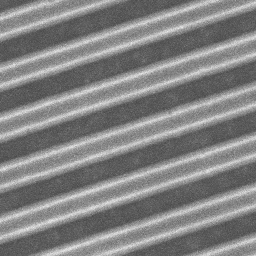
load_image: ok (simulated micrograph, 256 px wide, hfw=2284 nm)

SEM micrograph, parallel lines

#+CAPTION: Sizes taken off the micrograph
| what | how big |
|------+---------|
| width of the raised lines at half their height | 192 nm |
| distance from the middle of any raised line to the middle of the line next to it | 0.429 um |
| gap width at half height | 233 nanometers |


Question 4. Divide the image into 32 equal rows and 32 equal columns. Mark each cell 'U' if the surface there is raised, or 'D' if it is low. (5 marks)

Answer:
DDDDDUUUUUUUUDDDDDDDDDDDUUUUUUUU
DDUUUUUUUUDDDDDDDDDDDUUUUUUUUUDD
UUUUUUUDDDDDDDDDDDUUUUUUUUUDDDDD
UUUUDDDDDDDDDDDUUUUUUUUDDDDDDDDD
UDDDDDDDDDDDUUUUUUUUDDDDDDDDDDDU
DDDDDDDDDUUUUUUUUDDDDDDDDDDDUUUU
DDDDDDUUUUUUUUDDDDDDDDDDDUUUUUUU
DDDUUUUUUUUDDDDDDDDDDDUUUUUUUUUD
UUUUUUUUDDDDDDDDDDDUUUUUUUUUDDDD
UUUUUDDDDDDDDDDDUUUUUUUUUDDDDDDD
UUDDDDDDDDDDUUUUUUUUUUDDDDDDDDDD
DDDDDDDDDUUUUUUUUUDDDDDDDDDDDUUU
DDDDDDUUUUUUUUUDDDDDDDDDDDUUUUUU
DDDUUUUUUUUUDDDDDDDDDDDUUUUUUUUU
UUUUUUUUUDDDDDDDDDDDUUUUUUUUUDDD
UUUUUUDDDDDDDDDDDUUUUUUUUDDDDDDD
UUUDDDDDDDDDDDUUUUUUUUDDDDDDDDDD
DDDDDDDDDDDUUUUUUUUDDDDDDDDDDDUU
DDDDDDDUUUUUUUUUDDDDDDDDDDDUUUUU
DDDDUUUUUUUUUDDDDDDDDDDDUUUUUUUU
DUUUUUUUUUDDDDDDDDDDDUUUUUUUUUDD
UUUUUUUDDDDDDDDDDDUUUUUUUUUDDDDD
UUUUDDDDDDDDDDUUUUUUUUUUDDDDDDDD
UDDDDDDDDDDUUUUUUUUUDDDDDDDDDDDU
DDDDDDDDUUUUUUUUUDDDDDDDDDDDUUUU
DDDDDDUUUUUUUUDDDDDDDDDDDUUUUUUU
DDUUUUUUUUUDDDDDDDDDDDUUUUUUUUUD
UUUUUUUUDDDDDDDDDDDUUUUUUUUDDDDD
UUUUUDDDDDDDDDDDUUUUUUUUDDDDDDDD
UUDDDDDDDDDDUUUUUUUUUDDDDDDDDDDD
DDDDDDDDDUUUUUUUUUDDDDDDDDDDDUUU
DDDDDDUUUUUUUUUDDDDDDDDDDDUUUUUU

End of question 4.